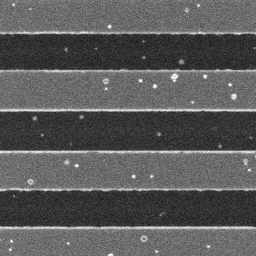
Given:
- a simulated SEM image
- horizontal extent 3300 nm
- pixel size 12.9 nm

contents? lines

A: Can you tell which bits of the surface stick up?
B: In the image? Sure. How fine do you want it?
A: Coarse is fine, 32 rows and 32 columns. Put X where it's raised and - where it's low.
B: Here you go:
XXXXXXXXXXXXXXXXXXXXXXXXXXXXXXXX
XXXXXXXXXXXXXXXXXXXXXXXXXXXXXXXX
XXXXXXXXXXXXXXXXXXXXXXXXXXXXXXXX
XXXXXXXXXXXXXXXXXXXXXXXXXXXXXXXX
--------------------------------
--------------------------------
--------------------------------
--------------------------------
--------------------------------
XXXXXXXXXXXXXXXXXXXXXXXXXXXXXXXX
XXXXXXXXXXXXXXXXXXXXXXXXXXXXXXXX
XXXXXXXXXXXXXXXXXXXXXXXXXXXXXXXX
XXXXXXXXXXXXXXXXXXXXXXXXXXXXXXXX
XXXXXXXXXXXXXXXXXXXXXXXXXXXXXXXX
--------------------------------
--------------------------------
--------------------------------
--------------------------------
--------------------------------
XXXXXXXXXXXXXXXXXXXXXXXXXXXXXXXX
XXXXXXXXXXXXXXXXXXXXXXXXXXXXXXXX
XXXXXXXXXXXXXXXXXXXXXXXXXXXXXXXX
XXXXXXXXXXXXXXXXXXXXXXXXXXXXXXXX
XXXXXXXXXXXXXXXXXXXXXXXXXXXXXXXX
--------------------------------
--------------------------------
--------------------------------
--------------------------------
XXXXXXXXXXXXXXXXXXXXXXXXXXXXXXXX
XXXXXXXXXXXXXXXXXXXXXXXXXXXXXXXX
XXXXXXXXXXXXXXXXXXXXXXXXXXXXXXXX
XXXXXXXXXXXXXXXXXXXXXXXXXXXXXXXX